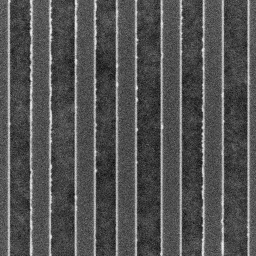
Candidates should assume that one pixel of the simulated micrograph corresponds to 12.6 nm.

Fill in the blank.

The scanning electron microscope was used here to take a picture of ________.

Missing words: lines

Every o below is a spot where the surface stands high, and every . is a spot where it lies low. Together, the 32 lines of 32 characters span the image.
o...oo...ooo...oo...ooo..ooo...o
o...oo...ooo...oo...ooo..ooo...o
o...oo...ooo...oo...ooo..ooo...o
o...oo...ooo...oo...ooo..ooo...o
o...oo...ooo...oo...ooo..ooo...o
o...oo...ooo...oo...ooo..ooo...o
o...oo...ooo...oo...ooo..ooo...o
o...oo...ooo...oo...ooo..ooo...o
o...oo...ooo...oo...ooo..ooo...o
o...oo...ooo...oo...ooo..ooo...o
o...oo...ooo...oo...ooo..ooo...o
o...oo...ooo...oo...ooo..ooo...o
o...oo...ooo...oo...ooo..ooo...o
o...oo...ooo...oo...ooo..ooo...o
o...oo...ooo...oo...ooo..ooo...o
o...oo...ooo...oo...ooo..ooo...o
o...oo...ooo...oo...ooo..ooo...o
o...oo...ooo...oo...ooo..ooo...o
o...oo...ooo...oo...ooo..ooo...o
o...oo...ooo...oo...ooo..ooo...o
o...oo...ooo...oo...ooo..ooo...o
o...oo...ooo...oo...ooo..ooo...o
o...oo...ooo...oo...ooo..ooo...o
o...oo...ooo...oo...ooo..ooo...o
o...oo...ooo...oo...ooo..ooo...o
o...oo...ooo...oo...ooo..ooo...o
o...oo...ooo...oo...ooo..ooo...o
o...oo...ooo...oo...ooo..ooo...o
o...oo...ooo...oo...ooo..ooo...o
o...oo...ooo...oo...ooo..ooo...o
o...oo...ooo...oo...ooo..ooo...o
o...oo...ooo...oo...ooo..ooo...o